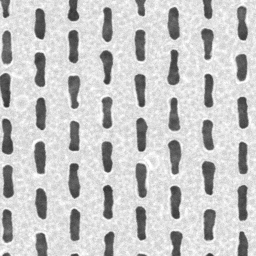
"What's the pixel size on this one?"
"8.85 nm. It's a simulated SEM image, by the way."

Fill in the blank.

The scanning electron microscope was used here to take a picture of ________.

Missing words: a regular array of holes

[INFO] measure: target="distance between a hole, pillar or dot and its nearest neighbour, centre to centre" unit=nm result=347